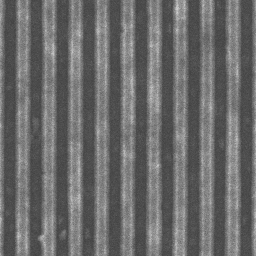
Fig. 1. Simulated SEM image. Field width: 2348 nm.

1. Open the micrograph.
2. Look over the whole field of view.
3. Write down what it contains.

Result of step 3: parallel lines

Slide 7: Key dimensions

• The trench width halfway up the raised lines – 0.136 microns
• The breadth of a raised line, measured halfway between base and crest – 104 nm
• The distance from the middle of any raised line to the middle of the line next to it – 26.3 px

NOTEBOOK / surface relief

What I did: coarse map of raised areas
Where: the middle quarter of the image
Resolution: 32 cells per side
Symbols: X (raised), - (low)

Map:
--XX----XXX----XX----XXX----XXX-
--XX----XXX----XX----XXX----XXX-
--XX----XXX----XX----XXX----XXX-
-XXX----XXX----XX----XXX----XXX-
-XXX----XXX----XX----XXX----XXX-
--XX----XXX----XX----XXX----XXX-
--XX----XXX----XX----XXX----XXX-
--XX----XXX----XX----XXX----XXX-
--XX----XXX----XX----XXX----XXX-
--XX----XXX----XX----XXX----XXX-
--XX----XXX----XX----XXX----XXX-
-XXX----XXX----XX----XXX----XXX-
-XXX----XXX----XX----XXX----XXX-
-XXX----XXX----XX----XXX----XX--
-XXX----XXX----XX----XXX----XX--
--XX----XXX----XX----XXX----XX--
--XX----XXX----XX----XXX----XX--
--XX----XXX----XX----XXX----XX--
--XX----XXX----XX----XXX----XX--
--XX----XXX----XX----XXX----XX--
--XX----XXX----XX----XXX----XX--
--XX----XXX----XX----XXX----XX--
--XX----XXX----XX----XXX----XX--
--XX----XXX----XX----XXX----XX--
--XX----XXX----XX----XXX----XX--
--XX----XXX----XX----XXX----XX--
--XX----XXX----XX----XXX----XX--
--XX----XXX----XX----XXX----XX--
--XX----XXX----XX----XXX----XX--
--XX----XXX----XX----XXX----XX--
--XX----XXX----XX----XXX----XX--
--XX----XXX----XX----XXX----XX--